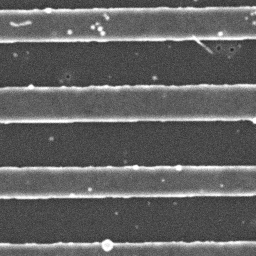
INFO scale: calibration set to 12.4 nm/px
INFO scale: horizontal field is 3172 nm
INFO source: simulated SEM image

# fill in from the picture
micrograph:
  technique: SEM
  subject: lines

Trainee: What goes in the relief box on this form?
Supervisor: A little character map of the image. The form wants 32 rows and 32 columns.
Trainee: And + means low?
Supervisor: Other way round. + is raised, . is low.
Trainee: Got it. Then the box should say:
................................
++++++++++++++++++++++++++++++++
++++++++++++++++++++++++++++++++
++++++++++++++++++++++++++++++++
++++++++++++++++++++++++++++++++
................................
................................
................................
................................
................................
................................
++++++++++++++++++++++++++++++++
++++++++++++++++++++++++++++++++
++++++++++++++++++++++++++++++++
++++++++++++++++++++++++++++++++
................................
................................
................................
................................
................................
................................
++++++++++++++++++++++++++++++++
++++++++++++++++++++++++++++++++
++++++++++++++++++++++++++++++++
++++++++++++++++++++++++........
................................
................................
................................
................................
................................
++.++.++++++++++++++++++++++++++
++++++++++++++++++++++++++++++++